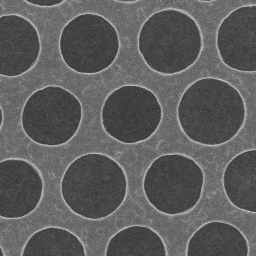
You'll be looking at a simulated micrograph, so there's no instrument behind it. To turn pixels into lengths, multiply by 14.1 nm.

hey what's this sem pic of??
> holes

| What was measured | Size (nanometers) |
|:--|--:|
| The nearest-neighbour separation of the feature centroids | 1130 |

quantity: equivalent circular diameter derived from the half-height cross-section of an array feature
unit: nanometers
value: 839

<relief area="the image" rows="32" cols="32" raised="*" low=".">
****...*************************
********************..*******...
...******....*****......****....
....****......****.......**.....
.....***.......**........**.....
.....***.......**........**.....
.....***.......***.......**.....
.....***......****......****....
....*****....******....******...
*.******************************
************************.....***
*****....*****.....****.......**
****......***.......***.......**
***.......***.......**.........*
***.......***.......**.........*
***.......***.......***.......**
***......****......****.......**
****.....******...******.....***
********************************
**********...*******...*******..
....*****......****......****...
.....***.......***.......***....
.....***........**.......***....
.....***........**.......***....
.....***........**.......***....
.....***.......****.....*****...
....*****.....******...*********
********************************
******.*********..*******....***
****.....*****......****......**
***.......****......****.......*
***........**........**........*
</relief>